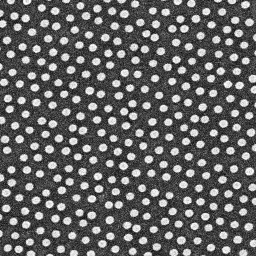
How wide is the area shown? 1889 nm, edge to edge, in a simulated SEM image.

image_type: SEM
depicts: a regular array of raised bodies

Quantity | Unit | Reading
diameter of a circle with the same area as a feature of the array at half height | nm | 53.3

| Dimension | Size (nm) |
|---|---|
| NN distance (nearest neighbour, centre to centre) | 95.8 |